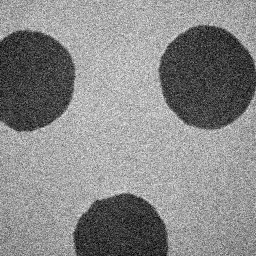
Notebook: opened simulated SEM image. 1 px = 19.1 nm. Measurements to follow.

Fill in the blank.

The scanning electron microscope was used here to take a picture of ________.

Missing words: raised bodies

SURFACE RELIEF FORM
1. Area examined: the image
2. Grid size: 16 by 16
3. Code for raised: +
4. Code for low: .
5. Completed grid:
................
................
++++.......++++.
++++......++++++
+++++.....++++++
+++++.....++++++
++++......++++++
++++.......++++.
................
................
................
................
......+++.......
.....+++++......
.....+++++......
.....++++++.....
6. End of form